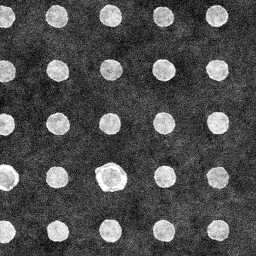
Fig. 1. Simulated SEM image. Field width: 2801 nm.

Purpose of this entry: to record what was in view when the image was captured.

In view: a regular array of raised bodies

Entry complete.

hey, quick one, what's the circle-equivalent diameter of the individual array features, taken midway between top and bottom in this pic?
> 230 nm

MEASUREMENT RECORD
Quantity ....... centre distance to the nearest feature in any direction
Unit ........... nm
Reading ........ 577